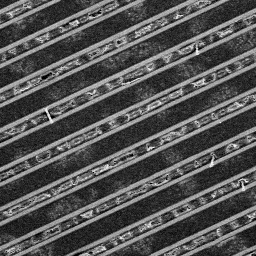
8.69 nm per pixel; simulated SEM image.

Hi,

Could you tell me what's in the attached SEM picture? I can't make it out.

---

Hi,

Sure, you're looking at parallel lines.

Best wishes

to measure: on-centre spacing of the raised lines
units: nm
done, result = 310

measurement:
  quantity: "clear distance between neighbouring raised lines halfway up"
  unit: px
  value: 12.9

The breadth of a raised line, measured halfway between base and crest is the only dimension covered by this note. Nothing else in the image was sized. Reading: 199 nm